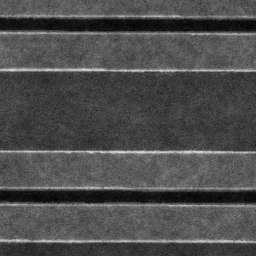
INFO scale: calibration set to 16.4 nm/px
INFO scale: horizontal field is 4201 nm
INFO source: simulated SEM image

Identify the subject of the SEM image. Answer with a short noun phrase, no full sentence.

lines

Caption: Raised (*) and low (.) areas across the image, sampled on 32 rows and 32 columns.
********************************
********************************
................................
................................
********************************
********************************
********************************
********************************
********************************
................................
................................
................................
................................
................................
................................
................................
................................
................................
................................
********************************
********************************
********************************
********************************
********************************
................................
**********...****...............
********************************
********************************
********************************
********************************
................................
................................